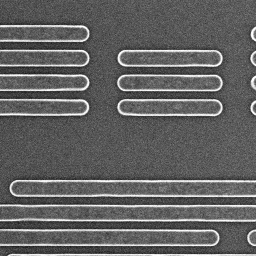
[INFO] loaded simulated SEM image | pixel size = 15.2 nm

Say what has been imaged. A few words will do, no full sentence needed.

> groups of lines, slits or small figures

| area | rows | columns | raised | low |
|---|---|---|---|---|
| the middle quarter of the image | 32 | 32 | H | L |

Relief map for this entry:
LLLLLLLLLLLLLLLLHHHHHHHHHHHHHLLL
LLLLLLLLLLLLLLLLLLLLLLLLLLLLLLLL
LLLLLLLLLLLLLLLLLLLLLLLLLLLLLLLL
HHHHHHLLLLLLLLHHHHHHHHHHHHHHHHHH
HHHHHHLLLLLLLLHHHHHHHHHHHHHHHHHH
HHHHHHLLLLLLLLHHHHHHHHHHHHHHHHHH
LLLLLLLLLLLLLLLHHHLLLLHHLLHHHHHH
LLLLLLLLLLLLLLLLLLLLLLLLLLLLLLLL
LLLLLLLLLLLLLLLLLLLLLLLLLLLLLLLL
HHHHHLLLLLLLLLHHHHHHHHHHHHHHHHHH
HHHHHHLLLLLLLLHHHHHHHHHHHHHHHHHH
HHHHHHLLLLLLLLHHHHHHHHHHHHHHHHHH
HHHHHLLLLLLLLLLHHHHHHHHHHHHHHHHH
LLLLLLLLLLLLLLLLLLLLLLLLLLLLLLLL
LLLLLLLLLLLLLLLLLLLLLLLLLLLLLLLL
LLLLLLLLLLLLLLLLLLLLLLLLLLLLLLLL
LLLLLLLLLLLLLLLLLLLLLLLLLLLLLLLL
LLLLLLLLLLLLLLLLLLLLLLLLLLLLLLLL
LLLLLLLLLLLLLLLLLLLLLLLLLLLLLLLL
LLLLLLLLLLLLLLLLLLLLLLLLLLLLLLLL
LLLLLLLLLLLLLLLLLLLLLLLLLLLLLLLL
LLLLLLLLLLLLLLLLLLLLLLLLLLLLLLLL
LLLLLLLLLLLLLLLLLLLLLLLLLLLLLLLL
LLLLLLLLLLLLLLLLLLLLLLLLLLLLLLLL
LLLLLLLLLLLLLLLLLLLLLLLLLLLLLLLL
LLLLLLLLLLLLLLLLLLLLLLLLLLLLLLLL
LLLLLLLLLLLLLLLLLLLLLLLLLLLLLLLL
LLLLLLLLLLLLLLLLLLLLLLLLLLLLLLLL
LLLLLLLLLLLLLLLLLLLLLLLLLLLLLLLL
HHHHHHHHHHHHHHHHHHHHHHHHHHHHHHHH
HHHHHHHHHHHHHHHHHHHHHHHHHHHHHHHH
HHHHHHHHHHHHHHHHHHHHHHHHHHHHHHHH